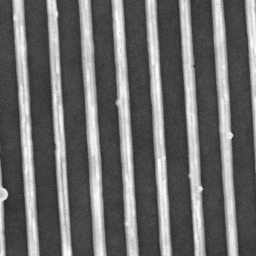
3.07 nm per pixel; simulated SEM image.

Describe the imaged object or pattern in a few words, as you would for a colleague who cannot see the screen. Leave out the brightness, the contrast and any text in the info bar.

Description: parallel lines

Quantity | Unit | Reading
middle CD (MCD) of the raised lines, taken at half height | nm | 26.4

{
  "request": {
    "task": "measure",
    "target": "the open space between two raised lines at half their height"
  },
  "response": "75.8 nm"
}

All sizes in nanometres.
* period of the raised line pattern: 102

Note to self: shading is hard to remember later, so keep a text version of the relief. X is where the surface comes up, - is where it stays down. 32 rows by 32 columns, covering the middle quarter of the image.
-----XX------XX-------XX------XX
-----XX------XX-------XX------XX
-----XX-------X-------XX------XX
-----XX-------XX------XX------XX
-----XXX------XX------XX------XX
-----XXX------XX------XX------XX
------XX------XX------XX------XX
------XX------XX------XX-------X
------XX------XX------XX-------X
------XX------XX------XX-------X
------XX------XX------XX-------X
------XX------XX------XX-------X
------XX------XX-------X-------X
------XX------XX-------XX------X
------XX------XX-------XX------X
------XX------XX-------XX------X
------XX------XX-------XX------X
------XX------XX-------XX------X
------XX-------X-------XX------X
------XX-------XX------XX------X
------XX-------XX------XX------X
-------XX------XX------XX------X
-------XX------XX------XX------X
-------XX------XX------XX-------
-------XX------XX------XX-------
-------XX------XX------XX-------
X------XX------XX------XX-------
X------XX------XX------XX-------
X------XX------XX------XX-------
X------XX------XX-------X-------
X------XX------XX-------XX------
X------XX------XX-------XX------